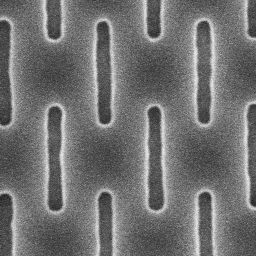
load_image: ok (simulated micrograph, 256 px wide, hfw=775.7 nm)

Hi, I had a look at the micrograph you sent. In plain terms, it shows holes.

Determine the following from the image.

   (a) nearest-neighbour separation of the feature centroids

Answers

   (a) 0.301 micrometres